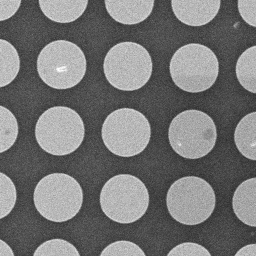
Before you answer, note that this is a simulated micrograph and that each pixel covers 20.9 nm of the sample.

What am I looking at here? an array of small figures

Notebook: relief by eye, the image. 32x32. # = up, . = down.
##...######..######..######...##
##...#####....#####...#####...##
.......##.....####.....###.....#
................................
................................
#.....###......##...............
##...#####....####....#####....#
##...######..######..######...##
##...######..######..######...##
##...#####...######..######...##
#.....####....####....#####...##
........................#......#
................................
#......#........................
##...#####....####....####.....#
##...#####...######..######...##
##...#####...######..######..###
##...#####...######..######..###
#....#####....####....#####...##
...............#.......##......#
................................
................................
#....####.....###.....###......#
##..######...#####...#####....##
##..######...######..######..###
##..######...#####...######..###
#....#####...#####...#####...###
......##......###.....####....##
................................
................................
#....####.....###......##.......
##..######...#####...#####....##